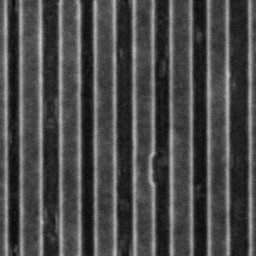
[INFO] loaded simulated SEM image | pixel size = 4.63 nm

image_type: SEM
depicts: parallel lines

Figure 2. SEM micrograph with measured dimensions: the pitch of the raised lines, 174 nm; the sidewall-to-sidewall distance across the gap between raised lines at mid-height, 17.3 pixels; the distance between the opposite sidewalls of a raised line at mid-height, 0.0961 microns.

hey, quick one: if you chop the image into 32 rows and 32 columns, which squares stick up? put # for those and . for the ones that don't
#..##..###..##...##..###..##...#
#..##..###..##...##..###..##...#
#..##..###..##...##..###..##...#
#..##..###..##...##..###..##...#
#..##..###..##...##..###..##...#
#..##..###..##...##..###..##...#
#..##..###..##...##..###..##...#
#..##..###..##...##..###..##...#
#..##..###..##...##..###..##...#
#..##..###..##...##..###..##...#
#..##..###..##...##..###..##...#
#..##...##..##...##..###..##...#
#..##...##..##...##..###..###..#
#..##...##..##...##..###..###..#
#..##...##..##...##..###..###..#
#..##...##..##...##..###..###..#
#..##...##..##...##..###..###..#
#..##...##..##...##..###..###..#
#..##...##..##...##..###..###..#
#..##...##..##...##..###..###..#
#..##...##..##...##..###..###..#
#..##...##..##...##..###..###..#
#..##...##..##...##..###..###..#
#..##...##..##...##..###..###..#
#..##...##..##...##..###..###..#
#..##...##..##...##..###..###..#
#..##...##..##...##..###..###..#
#..##...##..##...##..###..###..#
#..##...##..##...##..###..###..#
#..##...##..##...##..###..###..#
#..##...##..##...##..###..###..#
#..##...##..##...##..###..###..#